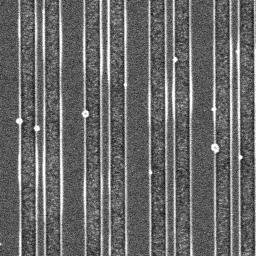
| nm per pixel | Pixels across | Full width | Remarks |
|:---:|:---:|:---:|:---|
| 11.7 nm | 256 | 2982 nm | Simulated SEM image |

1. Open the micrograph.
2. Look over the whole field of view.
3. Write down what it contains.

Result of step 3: groups of lines, slits or small figures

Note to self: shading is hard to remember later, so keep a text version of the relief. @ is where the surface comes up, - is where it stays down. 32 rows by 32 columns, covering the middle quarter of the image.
@@@@@----@@----@@@@@@----@@-----
@@@@@----@@----@@@@@@----@@-----
@@@@@----@@----@@@@@@----@@-----
@@@@@----@@----@@@@@@----@@-----
@@@@@----@@----@@@@@@----@@-----
@@@@@----@@----@@@@@@----@@-----
@@@@@----@@----@@@@@@----@@-----
@@@@@----@@----@@@@@@-----@-----
@@@@@----@@----@@@@@@-----@-----
@@@@@----@@----@@@@@@-----@-----
@@@@@----@@----@@@@@@-----@-----
@@@@@@---@@----@@@@@@-----@-----
@@@@@@---@@----@@@@@@-----@-----
@@@@@@---@@----@@@@@@----@@-----
@@@@@----@@----@@@@@@----@@@----
@@@@@----@@----@@@@@@----@@@----
@@@@@----@@----@@@@@@----@@@----
@@@@@----@@----@@@@@@@---@@@----
@@@@@----@@----@@@@@@@---@@@----
@@@@@----@@----@@@@@@@---@@@----
@@@@@----@@----@@@@@@@---@@@----
@@@@@----@@----@@@@@@@---@@@----
@@@@@----@@----@@@@@@@---@@@----
@@@@@----@@----@@@@@@@---@@@----
@@@@@----@@----@@@@@@@---@@@----
@@@@@----@@----@@@@@@@---@@@----
@@@@@----@@----@@@@@@@---@@@----
@@@@@----@@----@@@@@@@---@@@----
@@@@@----@@----@@@@@@@---@@@----
@@@@@----@@----@@@@@@@---@@@----
@@@@@----@@----@@@@@@@----@@----
@@@@@----@@----@@@@@@@----@@----